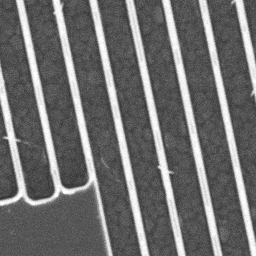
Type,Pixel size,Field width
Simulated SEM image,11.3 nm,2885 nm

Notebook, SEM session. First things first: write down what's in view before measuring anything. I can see parallel lines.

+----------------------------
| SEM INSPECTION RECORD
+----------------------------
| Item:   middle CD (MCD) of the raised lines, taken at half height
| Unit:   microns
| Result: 0.051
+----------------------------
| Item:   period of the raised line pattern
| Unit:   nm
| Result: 402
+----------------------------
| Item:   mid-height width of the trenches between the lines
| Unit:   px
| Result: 31.1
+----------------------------